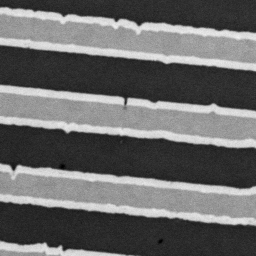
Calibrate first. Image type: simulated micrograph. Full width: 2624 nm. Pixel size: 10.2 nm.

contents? one or a few lines or trenches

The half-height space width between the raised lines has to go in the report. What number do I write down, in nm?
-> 486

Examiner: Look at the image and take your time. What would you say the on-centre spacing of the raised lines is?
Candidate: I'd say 797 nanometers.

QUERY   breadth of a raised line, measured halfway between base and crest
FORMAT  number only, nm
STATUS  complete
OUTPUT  310